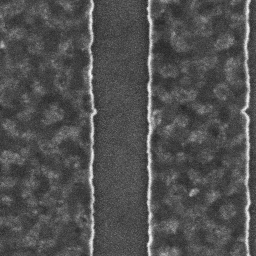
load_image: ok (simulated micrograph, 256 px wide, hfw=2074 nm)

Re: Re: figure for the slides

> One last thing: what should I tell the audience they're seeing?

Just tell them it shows one or a few lines or trenches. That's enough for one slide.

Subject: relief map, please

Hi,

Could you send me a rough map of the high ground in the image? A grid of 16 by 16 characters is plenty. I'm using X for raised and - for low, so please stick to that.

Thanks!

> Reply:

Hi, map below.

XXXXXX---XXXXXX-
XXXXXX---XXXXXX-
XXXXXX---XXXXXX-
XXXXXX---XXXXXX-
XXXXXX---XXXXXX-
XXXXXX---XXXXXXX
XXXXXX---XXXXXX-
XXXXXX---XXXXXX-
XXXXXX---XXXXXX-
XXXXXX---XXXXXXX
XXXXXX---XXXXXX-
XXXXXX---XXXXXX-
XXXXXX---XXXXXXX
XXXXXX---XXXXXX-
XXXXXX---XXXXXX-
XXXXXX---XXXXXX-